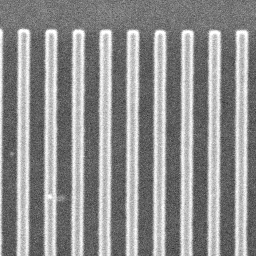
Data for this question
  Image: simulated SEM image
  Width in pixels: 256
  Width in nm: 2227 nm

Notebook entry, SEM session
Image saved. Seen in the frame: groups of lines, slits or small figures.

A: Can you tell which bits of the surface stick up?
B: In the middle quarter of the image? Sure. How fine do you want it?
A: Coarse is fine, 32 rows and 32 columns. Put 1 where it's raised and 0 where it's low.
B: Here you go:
00011000011000001100000110000011
00011000011000001100000110000011
00011000011000001100000110000011
00011000011000001100000110000011
00011000011000001100000110000011
00011000011000001100000110000011
00011000011000001100000110000011
00011000011000001100000110000011
00011000011000001100000110000011
00011000011000001100000110000011
00011000011000001100000110000011
00011000011000001100000110000011
00011000011000001100000110000011
00011000011000001100000110000011
00011000011000001100000110000011
00011000011000001100000110000011
00011000011000001100000110000011
00011000011000001100000110000011
00011000011000001100000110000011
00011000011000001100000110000011
00011000011000001100000110000011
00011000011000001100000110000011
00011000011000001100000110000011
00011000011000001100000110000011
00011000011000001100000110000011
00010000011000001100000110000011
00111000011000001100000110000011
00011000011000001100000110000011
00011000011000001100000110000011
00011000011000001100000110000011
00011000011000001100000110000011
00011000011000001100000110000011